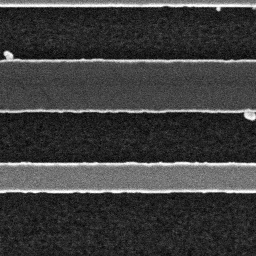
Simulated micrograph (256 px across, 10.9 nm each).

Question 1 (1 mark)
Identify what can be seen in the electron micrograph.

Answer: lines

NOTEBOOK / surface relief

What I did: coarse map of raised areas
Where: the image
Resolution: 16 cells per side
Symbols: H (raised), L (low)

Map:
LLLLLLLLLLLLLLLL
LLLLLLLLLLLLLLLL
LLLLLLLLLLLLLLLL
LLLLLLLLLLLLLLLL
HHHHHHHHHHHHHHHH
HHHHHHHHHHHHHHHH
HHHHHHHHHHHHHHHH
LLLLLLLLLLLLLLLL
LLLLLLLLLLLLLLLL
LLLLLLLLLLLLLLLL
HHHHHHHHHHHHHHHH
HHHHHHHHHHHHHHHH
LLLLLLLLLLLLLLLL
LLLLLLLLLLLLLLLL
LLLLLLLLLLLLLLLL
LLLLLLLLLLLLLLLL